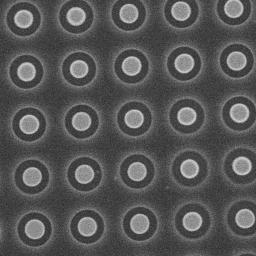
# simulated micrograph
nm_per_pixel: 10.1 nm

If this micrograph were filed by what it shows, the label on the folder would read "an array of small figures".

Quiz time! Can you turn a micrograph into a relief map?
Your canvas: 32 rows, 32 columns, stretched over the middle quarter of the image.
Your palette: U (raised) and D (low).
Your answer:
DDUUUUDDUUUUDDDUUUUDDUUUUUDDUUUU
DDUUUUDDUUUUDDDUUUUDDUUUUUDDUUUD
DDUUUDDDUUUUUDDDUUDDDUUUUUDDDDDD
DDDDDDDDUUUUUUDDDDDDUUUUUUUDDDDD
UDDDDDDUUUUUUUUDDDDUUUUUUUUUUUUU
UUUDDUUUUUUUUUUUUUUUUUUUUUUUUUUU
UUUUUUUUUUUUUUUUUUUUUUUUUUUUUUUU
UUUUUUUUUUUUUUUUUUUUUUUUUUUUUUUU
UUUUUUUUUUUUUUUUUUUUUUUUUUUUUUDU
UUUUUUUUUUUUUUUUDDDUUUUUUUUUDDDD
UUDDDDDUUUUUUUDDDDDDDUUUUUUDDDDD
UDDDDDDDUUUUUUDDDDDDDDUUUUDDDUUU
DDDUUUDDUUUUUDDDUUUDDDUUUUDDDUUU
DDUUUUDDDUUUUDDUUUUUDDUUUUDDDUUU
DDUUUUUDDUUUUDDUUUUUDDUUUUDDDUUU
DDUUUUDDDUUUUUDDUUUDDDUUUUUDDDDD
UDDDUDDDUUUUUUDDDDDDDUUUUUUUDDDD
UDDDDDDUUUUUUUUDDDDDUUUUUUUUUUDD
UUUDDDUUUUUUUUUUUUUUUUUUUUUUUUUU
UUUUUUUUUUUUUUUUUUUUUUUUUUUUUUUU
UUUUUUUUUUUUUUUUUUUUUUUUUUUUUUUU
UUUUUUUUUUUUUUUUUUUUUUUUUUUUUUUU
UUUUUUUUUUUUUUUUUDDUUUUUUUUUUDDD
UUUDDDDUUUUUUUUDDDDDDUUUUUUUDDDD
UUDDDDDDUUUUUUDDDDDDDDUUUUUDDDUU
UDDDUUDDDUUUUUDDDUUUDDDUUUUDDUUU
UDDUUUUDDUUUUUDDUUUUDDDUUUUDDUUU
UDDUUUUDDDUUUUDDUUUUDDDUUUUDDDUU
UDDUUUUDDDUUUUDDDUUUDDUUUUUDDDDD
UDDDUUDDDUUUUUUDDDDDDDUUUUUUDDDD
UUDDDDDDUUUUUUUUDDDDDUUUUUUUUUDD
UUUDDDDUUUUUUUUUUUUUUUUUUUUUUUUU